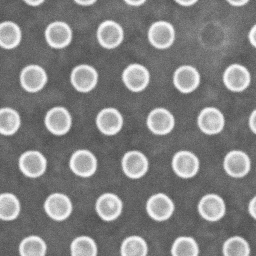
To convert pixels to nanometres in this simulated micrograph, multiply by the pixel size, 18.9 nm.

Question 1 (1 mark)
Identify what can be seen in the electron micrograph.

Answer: a regular array of raised bodies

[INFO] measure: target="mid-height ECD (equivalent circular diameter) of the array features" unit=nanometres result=468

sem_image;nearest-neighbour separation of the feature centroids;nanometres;938